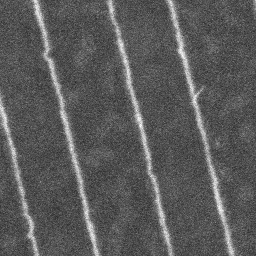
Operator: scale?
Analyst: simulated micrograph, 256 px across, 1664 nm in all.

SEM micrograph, one or a few lines or trenches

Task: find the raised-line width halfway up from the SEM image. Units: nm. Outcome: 387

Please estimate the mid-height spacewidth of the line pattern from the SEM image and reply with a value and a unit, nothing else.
459 nm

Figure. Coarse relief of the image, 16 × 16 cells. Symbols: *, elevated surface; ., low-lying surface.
**.....****.....
***....****.....
***....****.....
***.....***.....
***.....****....
****....****....
****....****....
****.....***....
.***.....****...
.****....****...
.****....****...
.****.....***...
.****.....****..
..***.....****..
..****....****..
..****.....***..